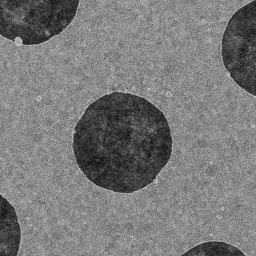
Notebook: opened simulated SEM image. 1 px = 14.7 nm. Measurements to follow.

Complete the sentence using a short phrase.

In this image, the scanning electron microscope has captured holes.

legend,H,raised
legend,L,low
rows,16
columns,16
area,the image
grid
LLLLLHHHHHHHHHHL
LLLLHHHHHHHHHHLL
HLLHHHHHHHHHHHLL
HHHHHHHHHHHHHHLL
HHHHHHHHHHHHHHLL
HHHHHHHHHHHHHHHL
HHHHHHLLLLHHHHHH
HHHHHLLLLLHHHHHH
HHHHHLLLLLLHHHHH
HHHHHLLLLLLHHHHH
HHHHHLLLLLHHHHHH
HHHHHHLLLHHHHHHH
HHHHHHHHHHHHHHHH
LHHHHHHHHHHHHHHH
LHHHHHHHHHHHHHHH
LHHHHHHHHHHHLLLH